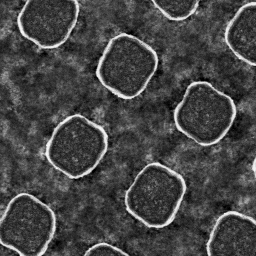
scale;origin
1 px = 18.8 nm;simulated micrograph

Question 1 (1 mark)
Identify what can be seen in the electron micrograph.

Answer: raised bodies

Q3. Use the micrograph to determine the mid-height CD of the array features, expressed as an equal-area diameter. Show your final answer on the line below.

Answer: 1090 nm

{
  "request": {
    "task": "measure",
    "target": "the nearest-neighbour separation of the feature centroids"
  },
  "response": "1730 nm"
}